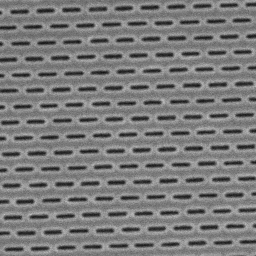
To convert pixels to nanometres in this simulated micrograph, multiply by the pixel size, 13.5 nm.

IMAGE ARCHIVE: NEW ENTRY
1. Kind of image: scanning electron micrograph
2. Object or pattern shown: a regular array of holes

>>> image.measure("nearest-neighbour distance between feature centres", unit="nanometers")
270